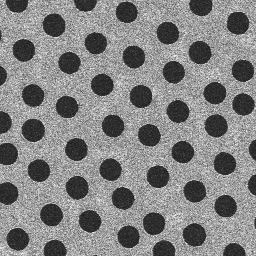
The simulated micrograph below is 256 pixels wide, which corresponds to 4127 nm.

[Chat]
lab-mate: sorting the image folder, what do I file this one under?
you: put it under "a regular array of holes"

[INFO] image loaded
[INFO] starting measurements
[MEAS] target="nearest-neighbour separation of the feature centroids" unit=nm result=578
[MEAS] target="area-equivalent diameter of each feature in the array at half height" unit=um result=0.371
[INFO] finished